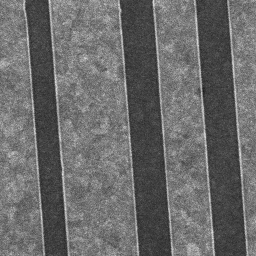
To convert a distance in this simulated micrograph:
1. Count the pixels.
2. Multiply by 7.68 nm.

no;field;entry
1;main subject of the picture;one or a few lines or trenches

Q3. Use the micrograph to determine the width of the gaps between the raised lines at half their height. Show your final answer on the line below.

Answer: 251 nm